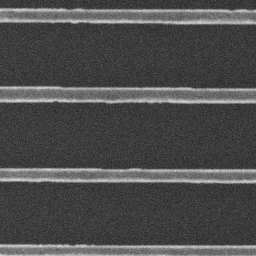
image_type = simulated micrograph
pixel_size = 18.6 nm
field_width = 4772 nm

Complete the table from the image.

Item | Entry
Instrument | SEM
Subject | lines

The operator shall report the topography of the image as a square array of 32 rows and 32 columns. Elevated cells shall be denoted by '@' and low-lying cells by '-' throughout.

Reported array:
--------------------------------
@@@@@@@@@@@@@@@@@@@@@@@@@@@@@@@@
@@@@@@@@@@@@@@@@@@@@@@@@@@@@@@@@
--------------------------------
--------------------------------
--------------------------------
--------------------------------
--------------------------------
--------------------------------
--------------------------------
--------------------------------
@@@@@@@@@@@@@@@@@@@@@@@@@@@@@@@@
@@@@@@@@@@@@@@@@@@@@@@@@@@@@@@@@
--------------------------------
--------------------------------
--------------------------------
--------------------------------
--------------------------------
--------------------------------
--------------------------------
--------------------------------
@@@@@@@@@@@@@@@@@@@@@@@@@@@@@@@@
@@@@@@@@@@@@@@@@@@@@@@@@@@@@@@@@
--------------------------------
--------------------------------
--------------------------------
--------------------------------
--------------------------------
--------------------------------
--------------------------------
--------------------------------
@@@@@@@@@@@@@@@@@@@@@@@@@@@@@@@@